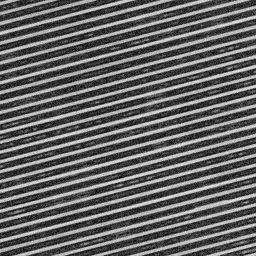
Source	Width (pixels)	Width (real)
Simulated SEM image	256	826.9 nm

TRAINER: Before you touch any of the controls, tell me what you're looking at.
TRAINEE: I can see parallel lines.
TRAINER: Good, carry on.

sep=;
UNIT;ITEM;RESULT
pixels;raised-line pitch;9.6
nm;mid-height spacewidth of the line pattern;22.7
